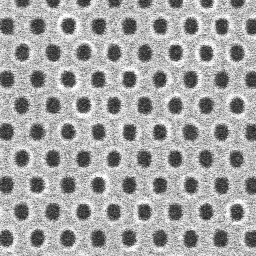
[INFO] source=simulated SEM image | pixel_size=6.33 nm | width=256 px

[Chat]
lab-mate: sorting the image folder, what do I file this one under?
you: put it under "a regular array of holes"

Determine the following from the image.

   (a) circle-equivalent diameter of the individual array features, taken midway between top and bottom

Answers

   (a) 113 nanometres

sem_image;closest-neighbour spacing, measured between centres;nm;192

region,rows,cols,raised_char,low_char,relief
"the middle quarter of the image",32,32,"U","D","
UUUUUUUUUUUUUUUUUUUUUUUUUUUUUUUU
DDUUUUUUDUUUUUUDDUUUUUUDDUUUUUUD
DDDUUUUDDDUUUUUDDDUUUUDDDDUUUUDD
DDDUUUUDDDDUUUDDDDUUUUDDDDUUUUDD
DDDUUUUDDDDUUUDDDDUUUUDDDDUUUUDD
DDDUUUUDDDUUUUUDDDUUUUDDDDUUUUDD
UUUUUUUUUUUUUUUUUUUUUUUUUUUUUUUU
UUUUUUUUUUUUUUUUUUUUUUUUUUUUUUUU
UUUUDDUUUUUDDDUUUUUDDUUUUUUDDUUU
UUUDDDDUUUDDDDUUUUDDDDUUUUDDDDUU
UUUDDDDUUUDDDDUUUUDDDDUUUUDDDDUU
UUUDDDDUUUUDDDUUUUDDDDUUUUDDDDUU
UUUUDUUUUUUDDDUUUUUDDUUUUUUDDUUU
UUUUUUUUUUUUUUUUUUUUUUUUUUUUUUUU
UUUUUUUUUUUUUUUUUUUUUUUUUUUUUUUU
DDUUUUUDDDUUUUUDDDUUUUDDDUUUUUDD
DDDUUUUDDDDUUUDDDDUUUUDDDDUUUUDD
DDDUUUUDDDDUUUDDDDUUUUDDDDUUUUDD
DDUUUUUDDDUUUUDDDDUUUUDDDDUUUUDD
UUUUUUUUUUUUUUUUUUUUUUUDUUUUUUUD
UUUUUUUUUUUUUUUUUUUUUUUUUUUUUUUU
UUUUDUUUUUUUDUUUUUUDDUUUUUUDDUUU
UUUDDDDUUUUDDDUUUUDDDDUUUUDDDDUU
UUUDDDDUUUDDDDUUUUDDDDUUUUDDDDUU
UUUDDDDUUUDDDDUUUUDDDDUUUUDDDDUU
UUUDDDUUUUUDDDUUUUUDDDUUUUDDDUUU
UUUUUUUUUUUUUUUUUUUUUUUUUUUUUUUU
UUUUUUUUUUUUUUUUUUUUUUUUUUUUUUUU
DDUUUUUDDDUUUUUDDDUUUUDDDUUUUUDD
DDDUUUUDDDDUUUDDDDUUUUDDDDUUUUDD
DDDUUUUDDDDUUUDDDDUUUUDDDDUUUUDD
DDDUUUUDDDUUUUDDDDUUUUDDDDUUUUDD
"